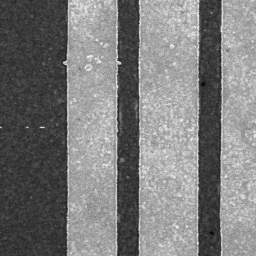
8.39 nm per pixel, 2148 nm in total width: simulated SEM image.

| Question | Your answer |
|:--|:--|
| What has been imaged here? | one or a few lines or trenches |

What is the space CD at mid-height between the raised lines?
195 nanometres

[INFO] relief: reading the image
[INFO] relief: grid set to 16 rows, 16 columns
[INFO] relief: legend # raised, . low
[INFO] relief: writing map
....###..###..##
....###..###..##
....###..###..##
....###..###..##
....###..###..##
....###..###..##
....###..###..##
....###..###..##
....###..###..##
....###..###..##
....###..###..##
....###..###..##
....###..###..##
....###..###..##
....###..###..##
....###..###..##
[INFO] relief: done